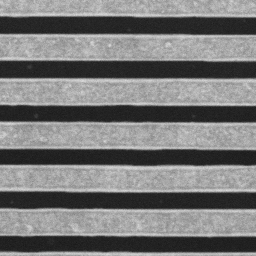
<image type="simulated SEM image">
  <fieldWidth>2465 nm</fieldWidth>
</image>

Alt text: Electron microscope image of lines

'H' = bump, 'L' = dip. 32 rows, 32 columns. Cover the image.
HHHHHHHHHHHHHHHHHHHHHHHHHHHHHHHH
HHHHHHHHHHHHHHHHHHHHHHHHHHHHHHHH
LLLLLLLLLLLLLLLLLLLLLLLLLLLLLLLL
LLLLLLLLLLLLLLLLLLLLLLLLLLLLLLLL
HHHHHHHHHHHHHHHHHHHHHHHHHHHHHHHH
HHHHHHHHHHHHHHHHHHHHHHHHHHHHHHHH
HHHHHHHHHHHHHHHHHHHHHHHHHHHHHHHH
HHHHHHHHHHHHHHHHHHHHHHHHHHHHHHHH
LLLLLLLLLLLLLLLLLLLLLLLLLLLLLLLL
LLLLLLLLLLLLLLLLLLLLLLLLLLLLLLLL
HHHHHHHHHHHHHHHHHHHHHHHHHHHHHHHH
HHHHHHHHHHHHHHHHHHHHHHHHHHHHHHHH
HHHHHHHHHHHHHHHHHHHHHHHHHHHHHHHH
LLLLLLLLLLLLLLLLLLLLLLLLLLLLLLLL
LLLLLLLLLLLLLLLLLLLLLLLLLLLLLLLL
HHHHHHHHHHHHHHHHHHHHHHHHHHHHHHHH
HHHHHHHHHHHHHHHHHHHHHHHHHHHHHHHH
HHHHHHHHHHHHHHHHHHHHHHHHHHHHHHHH
HHHHHHHHHHHHHHHHHHHHHHHHHHHHHHHH
LLLLLLLLLLLLLLLLLLLLLLLLLLLLLLLL
LLLLLLLLLLLLLLLLLLLLLLLLLLLLLLLL
HHHHHHHHHHHHHHHHHHHHHHHHHHHHHHHH
HHHHHHHHHHHHHHHHHHHHHHHHHHHHHHHH
HHHHHHHHHHHHHHHHHHHHHHHHHHHHHHHH
LLLLLLLLLLLLLLLLLLLLLLLLLLLLLLLL
LLLLLLLLLLLLLLLLLLLLLLLLLLLLLLLL
HHHHHHHHHHHHHHHHHHHHHHHHHHHHHHHH
HHHHHHHHHHHHHHHHHHHHHHHHHHHHHHHH
HHHHHHHHHHHHHHHHHHHHHHHHHHHHHHHH
LLLLLLLLLLLLLLLHLLHHHHHHHHHHHHHH
LLLLLLLLLLLLLLLLLLLLLLLLLLLLLLLL
LLLLLLLLLLLLLLLLLLLLLLLLLLLLLLLL